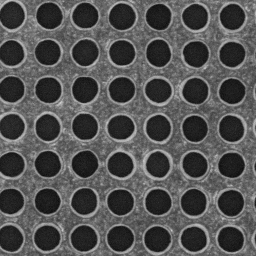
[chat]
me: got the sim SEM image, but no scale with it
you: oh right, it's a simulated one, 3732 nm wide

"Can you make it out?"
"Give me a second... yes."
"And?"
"a regular array of holes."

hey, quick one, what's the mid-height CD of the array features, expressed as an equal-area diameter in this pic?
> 396 nm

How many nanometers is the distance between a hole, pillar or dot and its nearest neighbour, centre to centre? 529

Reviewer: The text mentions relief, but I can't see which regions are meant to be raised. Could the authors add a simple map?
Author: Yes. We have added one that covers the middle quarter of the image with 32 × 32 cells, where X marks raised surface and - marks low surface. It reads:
XXXXX-XXXXXXXX-XXXXXXX---XXXXXX-
XXXXXXXXXXXXXXXXXXXXXXXXXXXXXXXX
XXXXXXXXXXXXXXXXXXXXXXXXXXXXXXXX
XXX----XXXXXX---XXXXXX---XXXXXX-
XXX-----XXXX-----XXXX-----XXXX--
XX-------XX-------XX-------XXX--
XX-------XX-------XX-------XXX--
XX-------XX-------XX-------XXX--
XX------XXXX-----XXXX------XXX--
XXXX---XXXXXX---XXXXXX----XXXXX-
XXXXXXXXXXXXXXXXXXXXXXXXXXXXXXXX
XXXXXXXXXXXXXXXXXXXXXXXXXXXXXXXX
XXXX--XXXXXXXXXXXXXXXXX-XXXXXXXX
XXX-----XXXX-----XXXX-----XXXXX-
XX-------XX------XXX-------XXX--
XX-------XX-------XX-------XX---
XX-------XX-------XX-------XX---
XX------XXX------XXXX------XXX--
XXX----XXXXX----XXXXXX----XXXX--
XXXXXXXXXXXXXXXXXXXXXXX--XXXXXXX
XXXXXXXXXXXXXXXXXXXXXXXXXXXXXXXX
XXXXXXXXXXXXXXXXXXXXXXXXXXXXXXXX
XXX-----XXXX----XXXXX-----XXXXX-
XX------XXX------XXXX-----XXXX--
XX-------XX------XXX-------XX---
XX-------XX-------XX-------XX---
XX------XXX------XXX-------XXX--
XXX----XXXXX-----XXXX-----XXXX--
XXXX--XXXXXXXX-XXXXXXXX-XXXXXXXX
XXXXXXXXXXXXXXXXXXXXXXXXXXXXXXXX
XXXXXXXXXXXXXXXXXXXXXXXXXXXXXXXX
XXX----XXXXX----XXXXXX---XXXXXX-